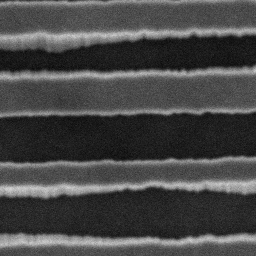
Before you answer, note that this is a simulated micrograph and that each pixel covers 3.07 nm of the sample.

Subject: lines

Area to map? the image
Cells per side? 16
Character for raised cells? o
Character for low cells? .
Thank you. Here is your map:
oooooooooooooooo
oooooooooooooooo
ooooo...........
................
.........ooooooo
oooooooooooooooo
oooooooooooooooo
................
................
................
oooooooooooooooo
oooooooooooooooo
................
................
................
oooooooooooooooo